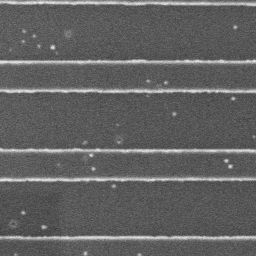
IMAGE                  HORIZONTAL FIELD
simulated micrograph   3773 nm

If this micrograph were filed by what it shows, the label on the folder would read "lines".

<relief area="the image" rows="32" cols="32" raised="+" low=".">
...............+++..++++++++++++
................................
................................
................................
................................
................................
................................
................................
++++++++++++++++++++++++++++++++
++++++++++++++++++++++++++++++++
++++++++++++++++++++++++++++++++
................................
................................
................................
................................
................................
................................
................................
................................
++++++++++++++++++++++++++++++++
++++++++++++++++++++++++++++++++
++++++++++++++++++++++++++++++++
++++++++++..+.++..++......+..+..
................................
................................
................................
................................
................................
................................
................................
++++++++++++++++++++++++++++++++
++++++++++++++++++++++++++++++++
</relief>